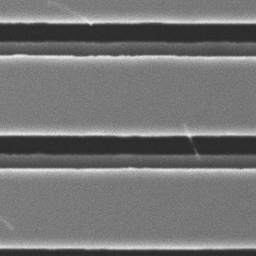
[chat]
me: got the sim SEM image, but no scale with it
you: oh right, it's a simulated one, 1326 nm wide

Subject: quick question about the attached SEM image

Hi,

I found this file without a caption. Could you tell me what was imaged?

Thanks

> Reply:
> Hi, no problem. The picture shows lines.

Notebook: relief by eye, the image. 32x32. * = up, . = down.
********************************
********************************
********************************
................................
................................
************..*********.********
********************************
********************************
********************************
********************************
********************************
********************************
********************************
********************************
********************************
********************************
********************************
................................
................................
***.**.........**.......*.......
********************************
********************************
********************************
********************************
********************************
********************************
********************************
********************************
********************************
********************************
********************************
................................